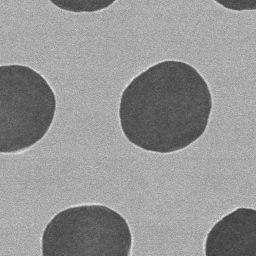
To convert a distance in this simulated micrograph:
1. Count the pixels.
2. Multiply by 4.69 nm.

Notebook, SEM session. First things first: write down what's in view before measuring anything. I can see holes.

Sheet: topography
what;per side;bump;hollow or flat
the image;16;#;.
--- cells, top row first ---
####..########..
################
################
################
..#######...####
...#####.....###
...#####.....###
...#####.....###
...#####....####
.#########.#####
################
################
################
###.....######..
###.....#####...
###.....#####...